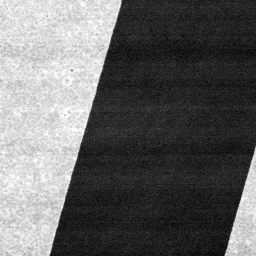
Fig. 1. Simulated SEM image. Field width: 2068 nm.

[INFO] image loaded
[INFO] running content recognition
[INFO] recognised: one or a few lines or trenches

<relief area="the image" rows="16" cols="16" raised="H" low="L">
HHHHHHHLLLLLLLLL
HHHHHHHLLLLLLLLL
HHHHHHHLLLLLLLLL
HHHHHHHLLLLLLLLL
HHHHHHLLLLLLLLLL
HHHHHHLLLLLLLLLL
HHHHHHLLLLLLLLLL
HHHHHLLLLLLLLLLL
HHHHHLLLLLLLLLLL
HHHHHLLLLLLLLLLL
HHHHHLLLLLLLLLLL
HHHHLLLLLLLLLLLH
HHHHLLLLLLLLLLLH
HHHHLLLLLLLLLLLH
HHHLLLLLLLLLLLLH
HHHLLLLLLLLLLLHH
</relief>